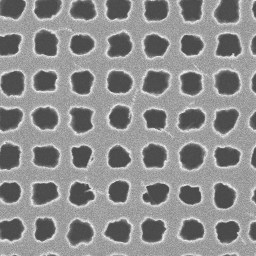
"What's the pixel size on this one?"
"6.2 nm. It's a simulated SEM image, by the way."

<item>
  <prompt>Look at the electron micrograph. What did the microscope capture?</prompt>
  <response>a regular array of holes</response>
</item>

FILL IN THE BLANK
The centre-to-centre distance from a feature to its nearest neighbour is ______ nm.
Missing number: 219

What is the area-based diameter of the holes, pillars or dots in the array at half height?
137 nm